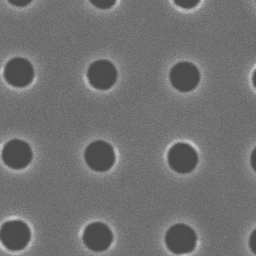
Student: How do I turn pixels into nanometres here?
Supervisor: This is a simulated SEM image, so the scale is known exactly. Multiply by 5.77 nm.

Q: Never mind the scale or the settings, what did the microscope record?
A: a regular array of holes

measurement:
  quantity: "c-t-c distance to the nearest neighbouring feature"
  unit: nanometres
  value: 470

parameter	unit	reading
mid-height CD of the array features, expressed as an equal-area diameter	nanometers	177